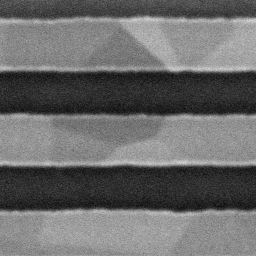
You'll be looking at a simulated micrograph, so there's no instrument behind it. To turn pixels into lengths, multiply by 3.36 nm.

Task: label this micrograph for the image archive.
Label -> lines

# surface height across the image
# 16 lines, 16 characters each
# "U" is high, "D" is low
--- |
DDDDDDDDDDDDDDDD
UUUUUUUUUUUUUUUU
UUUUUUUUUUUUUUUU
UUUUUUUUUUUUUUUU
DDDDDDDDDDDDDDDD
DDDDDDDDDDDDDDDD
DDDDDDDDDDDDDDDD
UUUUUUUUUUUUUUUU
UUUUUUUUUUUUUUUU
UUUUUUUUUUUUUUUU
DDDDDDDDDDDDDDDD
DDDDDDDDDDDDDDDD
DDDDDDDDDDDDDDDD
UUUUUUUUUUUUUUUU
UUUUUUUUUUUUUUUU
UUUUUUUUUUUUUUUU